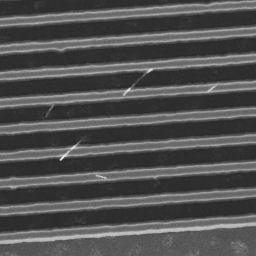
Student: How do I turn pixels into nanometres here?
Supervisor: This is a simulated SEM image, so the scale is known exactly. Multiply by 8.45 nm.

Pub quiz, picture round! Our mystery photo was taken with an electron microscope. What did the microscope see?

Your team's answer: parallel lines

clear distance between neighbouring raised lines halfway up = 141 nm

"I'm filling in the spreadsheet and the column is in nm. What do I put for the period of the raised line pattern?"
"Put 227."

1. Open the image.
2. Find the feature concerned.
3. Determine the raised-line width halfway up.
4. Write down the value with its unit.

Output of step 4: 10.2 px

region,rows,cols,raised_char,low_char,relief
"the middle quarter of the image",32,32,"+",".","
...+.+++++++++++++++++++++++++++
++++++++++++++++++++++..........
++++++++........................
................................
................................
...........................+..++
.............++.++++++++++++++++
++++++++++++++++++++++++++++++++
++++++++++++++++++..............
++++............................
................................
................................
.......................+++++++++
.........+++++++++++++++++++++++
+++++++++++++++++++++++++++.....
++++++++++++++..................
................................
................................
................................
....................++++++++++++
...+..++++++++++++++++++++++++++
++++++++++++++++++++++++........
+++++++++++.....................
................................
................................
..............................++
................++++++++++++++++
..++++++++++++++++++++++++++++++
+++++++++++++++++++++.++........
+++++++.........................
................................
................................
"